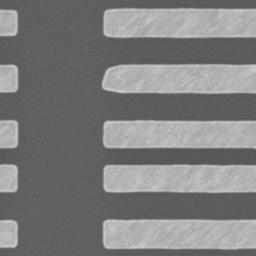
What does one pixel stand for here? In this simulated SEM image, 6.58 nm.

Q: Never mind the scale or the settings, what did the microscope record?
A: wiring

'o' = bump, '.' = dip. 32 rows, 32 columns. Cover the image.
................................
oo...........ooooooooooooooooooo
oo...........ooooooooooooooooooo
oo...........ooooooooooooooooooo
.............ooooooooooooooooooo
................................
................................
................................
oo............oooooooooooooooooo
oo...........ooooooooooooooooooo
oo...........ooooooooooooooooooo
...............ooooooooooooooooo
................................
................................
................................
oo...........ooooooooooooooooooo
oo...........ooooooooooooooooooo
oo...........ooooooooooooooooooo
...............................o
................................
................................
oo...........ooooooooooooooooooo
oo...........ooooooooooooooooooo
oo...........ooooooooooooooooooo
................................
................................
................................
................................
oo...........ooooooooooooooooooo
oo...........ooooooooooooooooooo
oo...........ooooooooooooooooooo
................................